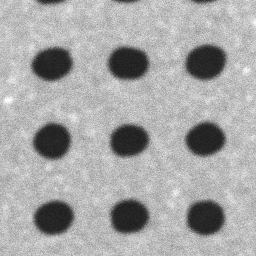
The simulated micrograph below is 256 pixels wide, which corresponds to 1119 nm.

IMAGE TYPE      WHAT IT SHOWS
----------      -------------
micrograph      a regular array of holes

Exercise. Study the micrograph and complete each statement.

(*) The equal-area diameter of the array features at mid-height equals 162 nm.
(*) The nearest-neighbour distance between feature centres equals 332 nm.